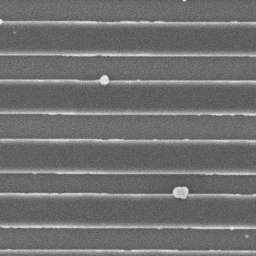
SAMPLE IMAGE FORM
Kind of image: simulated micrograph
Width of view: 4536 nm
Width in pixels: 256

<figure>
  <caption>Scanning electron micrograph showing lines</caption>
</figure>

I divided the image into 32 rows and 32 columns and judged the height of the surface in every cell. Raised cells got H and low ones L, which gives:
LLLLLLLLLLLLLLLLLLLLLLLLLLLLLLLL
LLLLLLLLLLLLLLLLLLLLLLLLLLLLLLLL
LLLLLLLLLLLLLLLLLLLLLLLLLLLLLLLL
HHHHHHHHHHHHHHHHHHHHHHHHHHHHHHHH
HHHHHHHHHHHHHHHHHHHHHHHHHHHHHHHH
HHHHHHHHHHHHHHHHHHHHHHHHHHHHHHHH
HHHHHHHHHHHHHHHHHHHHHHHHHHHHHHHH
LLLLLLLLLLLLLLLLLLLLLLLLLLLLLLLL
LLLLLLLLLLLLLLLLLLLLLLLLLLLLLLLL
LLLLLLLLLLLLLLLLLLLLLLLLLLLLLLLL
HHHHHHHHHHHHHHHHHHHHHHHHHHHHHHHH
HHHHHHHHHHHHHHHHHHHHHHHHHHHHHHHH
HHHHHHHHHHHHHHHHHHHHHHHHHHHHHHHH
HHHHHHHHHHHHHHHHHHHHHHHHHHHHHHHH
LLLLLLLLLLLLLLLLLLLLLLLLLLLLLLLL
LLLLLLLLLLLLLLLLLLLLLLLLLLLLLLLL
LLLLLLLLLLLLLLLLLLLLLLLLLLLLLLLL
HHHHHHHHHHHHHHHHLLLHLLLHLLLLLLLL
HHHHHHHHHHHHHHHHHHHHHHHHHHHHHHHH
HHHHHHHHHHHHHHHHHHHHHHHHHHHHHHHH
HHHHHHHHHHHHHHHHHHHHHHHHHHHHHHHH
HHHHHHHHHHHHHHHHHHHHHHHHHHHHHHHH
LLLLLLLLLLLLLLLLLLLLLLLLLLLLLLLL
LLLLLLLLLLLLLLLLLLLLLLHLLLLLLLLL
HHHHHHHHHHHHHHHHHHHHHHHHHHHHHHHH
HHHHHHHHHHHHHHHHHHHHHHHHHHHHHHHH
HHHHHHHHHHHHHHHHHHHHHHHHHHHHHHHH
HHHHHHHHHHHHHHHHHHHHHHHHHHHHHHHH
LLLLLLLLLLLLLLLLLLLLHLLLHHHHHHHH
LLLLLLLLLLLLLLLLLLLLLLLLLLLLLLLL
LLLLLLLLLLLLLLLLLLLLLLLLLLLLLLLL
HHHHHHHHHHHHHHHHHHHHHHHHHHHHHHHH